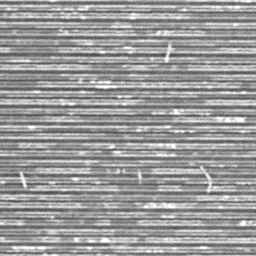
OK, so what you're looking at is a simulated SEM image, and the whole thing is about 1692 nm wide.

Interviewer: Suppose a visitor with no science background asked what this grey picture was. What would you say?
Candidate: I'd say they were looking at parallel lines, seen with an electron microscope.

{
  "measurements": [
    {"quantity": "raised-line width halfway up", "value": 4.49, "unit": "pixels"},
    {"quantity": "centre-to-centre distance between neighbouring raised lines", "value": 57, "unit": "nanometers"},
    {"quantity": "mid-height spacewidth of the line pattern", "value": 29.7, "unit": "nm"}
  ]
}